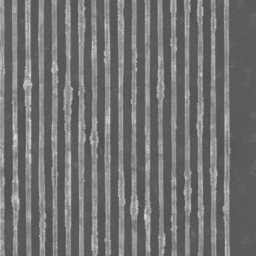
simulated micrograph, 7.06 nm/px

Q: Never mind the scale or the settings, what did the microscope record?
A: parallel lines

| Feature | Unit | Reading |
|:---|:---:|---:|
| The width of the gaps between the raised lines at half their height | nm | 60.9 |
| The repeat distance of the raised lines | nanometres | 93.3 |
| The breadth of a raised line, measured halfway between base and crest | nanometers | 30.9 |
